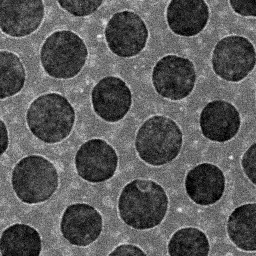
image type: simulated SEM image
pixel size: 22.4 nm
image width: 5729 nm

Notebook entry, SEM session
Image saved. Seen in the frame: a regular array of holes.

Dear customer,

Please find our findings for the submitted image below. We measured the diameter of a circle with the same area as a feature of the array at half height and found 44.9 pixels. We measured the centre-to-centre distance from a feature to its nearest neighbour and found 1420 nanometers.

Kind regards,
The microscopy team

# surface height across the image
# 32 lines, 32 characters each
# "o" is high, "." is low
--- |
.....oo......oooooooo.....ooo...
......ooo...ooo..oooo.....ooo...
.....ooooooooo....ooo.....oooooo
.....oooooooo.....ooo....ooooooo
o..ooo....ooo.....ooooo.ooooo.oo
ooooo......oo.....ooooooooo.....
.oooo......ooo...oooooooooo.....
...oo......ooooooooo....oo......
...oo.....ooooooooo.....ooo.....
...ooo...oooooooooo......oo....o
...ooooooooo....ooo.....oooooooo
..ooooooooo.....oooo....oooooooo
oooo....ooo.....ooooooooooo.oooo
oooo.....ooo....ooooooooo....ooo
ooo......ooo....ooo.ooooo.....oo
.oo......ooooooooo....ooo.....oo
.ooo.....oooooooo......oo.....oo
.oooo...ooo..oooo......ooo...ooo
.ooooooooo....ooo......oooooooo.
ooo..oooo......oo.....oooooooo..
oo.....oo......oooo..oooo..ooo..
oo.....ooo....oooooooooo....ooo.
o......oooo..oooo..oooo.....ooo.
oo.....oooooooo.....ooo.....oooo
oo....ooooooooo......ooo....oooo
ooooooooo..oooo......oooo..oooo.
oooooooo....ooo......oooooooo...
oooooooo.....oo.....oooooooo....
o...oooo.....oooo..oooo..ooo....
.....ooo....oooooooooo....ooo...
.....oooo..oooooooooo.....ooo...
.....ooooooooo....ooo.....oooooo